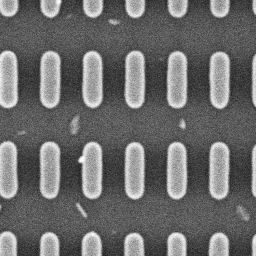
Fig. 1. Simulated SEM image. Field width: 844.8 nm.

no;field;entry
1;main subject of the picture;groups of lines, slits or small figures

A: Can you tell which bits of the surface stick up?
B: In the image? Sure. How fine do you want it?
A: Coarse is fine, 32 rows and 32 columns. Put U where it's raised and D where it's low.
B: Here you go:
UUDDDUUUDDUUUDDDUUDDDUUDDDUUUDDD
UUDDDUUDDDDUUDDDUUDDDUUDDDUUDDDD
DDDDDDDDDDDDDDDDDDDDDDDDDDDDDDDD
DDDDDDDDDDDDDDDDDDDDDDDDDDDDDDDD
DDDDDDDDDDDDDDDDDDDDDDDDDDDDDDDD
DDDDDDDDDDDDDDDDDDDDDDDDDDDDDDDD
DDDDDDUDDDDUDDDDDDDDDDDDDDDDDDDD
UUDDDUUDDDUUUDDDUUDDDUUDDDUUUDDD
UUDDDUUDDDUUUDDDUUDDDUUDDDUUUDDD
UUDDDUUDDDUUUDDDUUDDDUUDDDUUUDDD
UUDDDUUDDDUUUDDDUUDDDUUDDDUUUDDD
UUDDDUUDDDUUUDDDUUDDDUUDDDUUUDDD
UUDDDUUDDDDUUDDDUUDDDUUDDDUUDDDD
DDDDDDDDDDDDDDDDDDDDDDDDDDDDDDDD
DDDDDDDDDDDDDDDDDDDDDDDDDDDDDDDD
DDDDDDDDDDDDDDDDDDDDDDDDDDDDDDDD
DDDDDDDDDDDDDDDDDDDDDDDDDDDDDDDD
DDDDDDDDDDDDDDDDDDDDDDDDDDDDDDDD
UUDDDUUDDDDUUDDDUUDDDUUDDDUUDDDD
UUDDDUUDDDUUUDDDUUDDDUUDDDUUUDDD
UUDDDUUDDDUUUDDDUUDDDUUDDDUUUDDD
UUDDDUUDDDUUUDDDUUDDDUUDDDUUUDDD
UUDDDUUDDDUUUDDDUUDDDUUDDDUUDDDD
UUDDDUUDDDUUUDDDUUDDDUUDDDUUDDDD
UUDDDDUDDDDUDDDDUUDDDUUDDDDUDDDD
DDDDDDDDDDDDDDDDDDDDDDDDDDDDDDDD
DDDDDDDDDDDDDDDDDDDDDDDDDDDDDDDD
DDDDDDDDDDDDDDDDDDDDDDDDDDDDDDDD
DDDDDDDDDDDDDDDDDDDDDDDDDDDDDDDD
UUDDDUUDDDDUDDDDUUDDDUUDDDDUDDDD
UUDDDUUDDDUUUDDDUUDDDUUDDDUUDDDD
UUDDDUUDDDUUUDDDUUDDDUUDDDUUDDDD